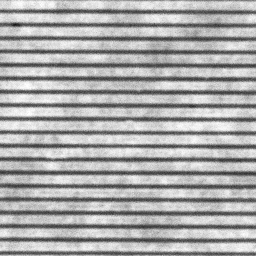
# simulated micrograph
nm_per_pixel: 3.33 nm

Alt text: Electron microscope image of parallel lines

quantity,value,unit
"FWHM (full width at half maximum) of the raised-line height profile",23.7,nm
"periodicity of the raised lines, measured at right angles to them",44.7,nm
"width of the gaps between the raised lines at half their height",0.0208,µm